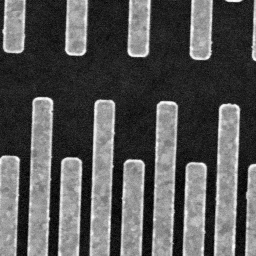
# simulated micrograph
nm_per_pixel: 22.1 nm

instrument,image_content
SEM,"parallel lines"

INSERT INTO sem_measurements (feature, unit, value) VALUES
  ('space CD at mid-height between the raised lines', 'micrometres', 0.251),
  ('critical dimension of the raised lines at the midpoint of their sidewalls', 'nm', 442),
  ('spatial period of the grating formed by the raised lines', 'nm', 688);